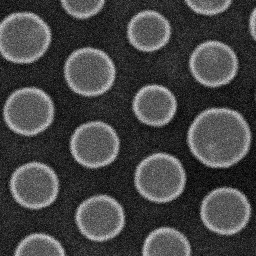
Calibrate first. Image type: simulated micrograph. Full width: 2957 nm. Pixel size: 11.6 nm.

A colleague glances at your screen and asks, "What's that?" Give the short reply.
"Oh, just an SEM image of a regular array of raised bodies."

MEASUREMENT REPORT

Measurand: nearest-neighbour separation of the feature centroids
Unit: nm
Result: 832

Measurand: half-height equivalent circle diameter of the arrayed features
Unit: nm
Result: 527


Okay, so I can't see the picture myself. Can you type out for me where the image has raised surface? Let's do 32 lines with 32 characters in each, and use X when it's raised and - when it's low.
--------XXXXX-----------XXXXX---
---------XXX------X------XX-----
-XXXX------------XXXX----------X
XXXXXX----------XXXXX----------X
XXXXXX----------XXXXX-----------
XXXXXX-----------XXX------XX----
XXXXX-----XXX-----------XXXXX---
-XXX-----XXXXX----------XXXXXX--
--------XXXXXX----------XXXXXX--
--------XXXXXX----------XXXXX---
---------XXXXX-----------XXX----
--XXX-----XXX----XXXX-----------
-XXXXX-----------XXXXX----------
-XXXXXX----------XXXXX----------
-XXXXXX----------XXXX----XXXXX--
-XXXXX-----XX------X----XXXXXXX-
--XXX-----XXXX----------XXXXXXX-
---------XXXXXX---------XXXXXXX-
---------XXXXXX---------XXXXXXX-
---------XXXXX-----XX----XXXXX--
----X-----XXX-----XXXX----XXX---
--XXXXX----------XXXXXX---------
-XXXXXX----------XXXXXX---------
-XXXXXX----------XXXXXX---------
--XXXXX-----------XXXX----XXXX--
---XXX----XXXXX----------XXXXXX-
----------XXXXX----------XXXXXX-
----------XXXXX----------XXXXXX-
----------XXXXX-----------XXXX--
----XX-----XXX-----XXXX---------
---XXXX-----------XXXXX---------
--XXXXXX----------XXXXXX--------